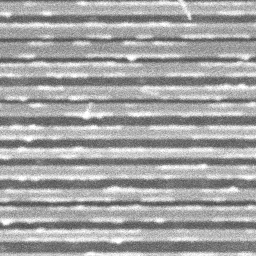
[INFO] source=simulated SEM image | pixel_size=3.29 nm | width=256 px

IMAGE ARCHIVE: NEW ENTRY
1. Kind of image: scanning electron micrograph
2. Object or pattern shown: parallel lines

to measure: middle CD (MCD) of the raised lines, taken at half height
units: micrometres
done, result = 0.0415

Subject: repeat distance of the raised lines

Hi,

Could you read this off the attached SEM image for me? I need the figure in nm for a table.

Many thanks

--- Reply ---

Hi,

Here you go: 67.9